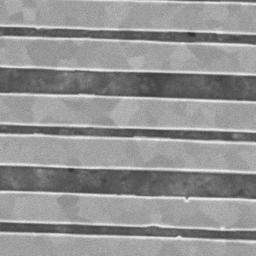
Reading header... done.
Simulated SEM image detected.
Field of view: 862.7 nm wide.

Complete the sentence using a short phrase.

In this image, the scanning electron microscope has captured parallel lines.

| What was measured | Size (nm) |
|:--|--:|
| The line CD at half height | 100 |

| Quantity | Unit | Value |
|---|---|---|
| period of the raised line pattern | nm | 170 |